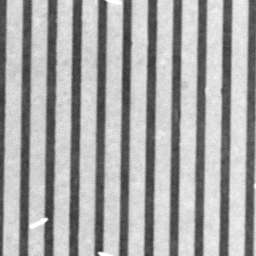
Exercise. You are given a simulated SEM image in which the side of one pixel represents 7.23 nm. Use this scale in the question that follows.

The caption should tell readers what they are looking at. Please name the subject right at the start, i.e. parallel lines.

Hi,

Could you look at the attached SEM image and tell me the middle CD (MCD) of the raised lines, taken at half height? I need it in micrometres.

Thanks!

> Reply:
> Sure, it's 0.105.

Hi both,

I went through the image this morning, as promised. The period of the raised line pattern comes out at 181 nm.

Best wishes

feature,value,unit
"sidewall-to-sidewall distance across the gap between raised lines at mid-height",74.1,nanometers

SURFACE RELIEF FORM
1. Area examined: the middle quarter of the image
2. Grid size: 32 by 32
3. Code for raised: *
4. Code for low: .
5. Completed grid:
**...***...***...***...****...**
**...***...***...***...****...**
**...***...***...***...****...**
**...***...***...***...****...**
**...***...***...***...****...**
**..****...***...***...****...**
**..****...***...***...****...**
**...***...***...***...****..***
**...***...***...***...****..***
**..****...***...***...****..***
*...****...***...***...****..***
**..****...***...***...****..***
**..****...***...***...****..***
**..****...***...***...****..***
**..****...***...***...****..***
**..****...***...***...****..***
**..****...***...***...****..***
**..****...***...***...****..***
**..****...***...***...****..***
*...****...***...***...****..***
*...****...***...***...***...***
**..****...***...***...***...***
*...****..****...***...***...***
*...****..****...***...***...***
*...****..****...***...***...***
*...****..****...***...***...***
*...****..****...***...***...***
*...****..****...***...***...***
*...****..****...***...***...***
*...****..****...***...***...***
*...****..****...***...***...***
*...****..****...***...***...***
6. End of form